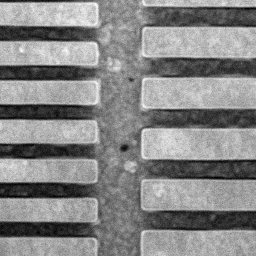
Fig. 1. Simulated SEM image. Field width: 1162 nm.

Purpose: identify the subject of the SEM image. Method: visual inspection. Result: groups of lines, slits or small figures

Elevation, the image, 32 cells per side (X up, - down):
XXXXXXXXXXXX------XXXXXXXXXXXXXX
XXXXXXXXXXXX--------------------
XXXXXXXXXXXX--------------------
--------------------------------
------------------XXXXXXXXXXXXXX
XXXXXXXXXXXX------XXXXXXXXXXXXXX
XXXXXXXXXXXX------XXXXXXXXXXXXXX
XXXXXXXXXXXX--------------------
--------------------------------
--------------------------------
XXXXXXXXXXXX------XXXXXXXXXXXXXX
XXXXXXXXXXXX------XXXXXXXXXXXXXX
XXXXXXXXXXXX------XXXXXXXXXXXXXX
--------------------------------
--------------------------------
XXXXXXXXXXXX--------------------
XXXXXXXXXXXX------XXXXXXXXXXXXXX
XXXXXXXXXXXX------XXXXXXXXXXXXXX
------------------XXXXXXXXXXXXXX
------------------XXXXXXXXXXXXXX
XXXXXXXXXXXX--------------------
XXXXXXXXXXXX--------------------
XXXXXXXXXXXX--------------------
------------------XXXXXXXXXXXXXX
------------------XXXXXXXXXXXXXX
XXXXXXXXXXXX------XXXXXXXXXXXXXX
XXXXXXXXXXXX--------------------
XXXXXXXXXXXX--------------------
--------------------------------
------------------XXXXXXXXXXXXXX
XXXXXXXXXXXX------XXXXXXXXXXXXXX
XXXXXXXXXXXX------XXXXXXXXXXXXXX